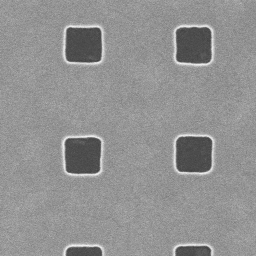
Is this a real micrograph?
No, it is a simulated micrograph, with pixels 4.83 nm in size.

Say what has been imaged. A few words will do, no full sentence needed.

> holes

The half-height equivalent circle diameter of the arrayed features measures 0.196 µm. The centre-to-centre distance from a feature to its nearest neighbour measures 529 nm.